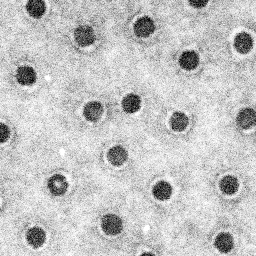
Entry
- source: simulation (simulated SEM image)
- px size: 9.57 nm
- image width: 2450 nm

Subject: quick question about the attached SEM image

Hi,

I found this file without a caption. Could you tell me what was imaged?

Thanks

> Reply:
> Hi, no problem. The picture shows a regular array of raised bodies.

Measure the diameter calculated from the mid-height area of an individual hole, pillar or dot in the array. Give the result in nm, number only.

251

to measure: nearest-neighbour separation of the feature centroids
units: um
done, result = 0.548